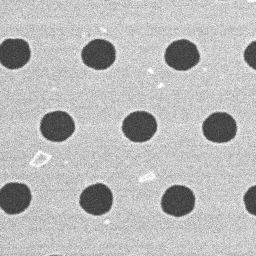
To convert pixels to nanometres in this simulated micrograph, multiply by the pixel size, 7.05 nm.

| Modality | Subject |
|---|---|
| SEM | holes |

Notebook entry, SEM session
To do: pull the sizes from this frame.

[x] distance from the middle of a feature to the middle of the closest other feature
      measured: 0.574 um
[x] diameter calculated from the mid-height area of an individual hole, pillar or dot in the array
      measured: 0.236 microns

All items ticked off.